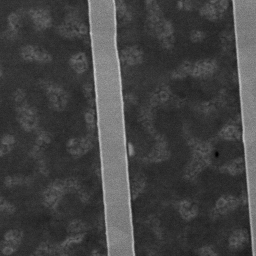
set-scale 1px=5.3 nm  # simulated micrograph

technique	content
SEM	one or a few lines or trenches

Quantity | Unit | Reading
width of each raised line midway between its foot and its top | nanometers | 136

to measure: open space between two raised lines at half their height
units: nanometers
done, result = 627